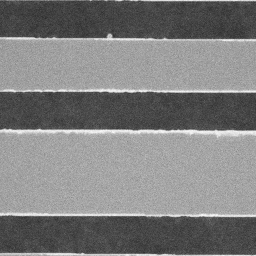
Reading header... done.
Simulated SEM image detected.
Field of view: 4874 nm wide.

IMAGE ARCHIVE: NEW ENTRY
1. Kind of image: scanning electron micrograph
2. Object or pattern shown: lines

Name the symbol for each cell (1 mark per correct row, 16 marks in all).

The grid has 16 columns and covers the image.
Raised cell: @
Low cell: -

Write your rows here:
----------------
----------------
@@@@@@@@@@@@@@@@
@@@@@@@@@@@@@@@@
@@@@@@@@@@@@@@@@
@@@@@@@@@@@@@@@@
----------------
----------------
@@@@@@@@@@@@@@@@
@@@@@@@@@@@@@@@@
@@@@@@@@@@@@@@@@
@@@@@@@@@@@@@@@@
@@@@@@@@@@@@@@@@
------------@@@@
----------------
----------------